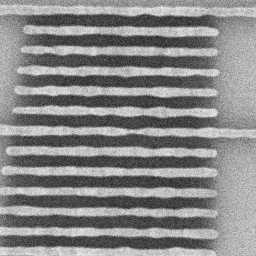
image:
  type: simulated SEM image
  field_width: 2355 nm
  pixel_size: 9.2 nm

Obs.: groups of lines, slits or small figures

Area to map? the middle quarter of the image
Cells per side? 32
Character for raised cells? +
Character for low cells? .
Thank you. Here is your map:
................................
++++++++++++++++++++++++++++++++
++++++++++++++++++++++++++++++++
................................
................................
................................
++++++++++++++++++++++++++++++++
...++++++..+++++++++++++++++++++
................................
................................
................................
++++++++++++++++++++++++++++++++
++++++.+++++++++++++++++++++++++
................................
................................
................................
++++++++++++++++..++++++++++++++
++.++++..+++++++...+++++++++++++
................................
................................
................................
++++++++++++++++++++++++++++++++
++++++++++++++++++++++++++++++++
................................
................................
................................
++++++++++++++++++++++.+++++++++
++++++++++++++++++++++++++++++++
................................
................................
................................
++++++++++++++++++++++++++++++++